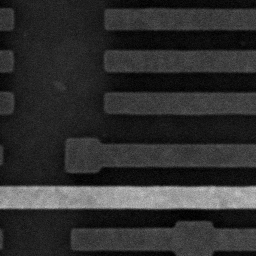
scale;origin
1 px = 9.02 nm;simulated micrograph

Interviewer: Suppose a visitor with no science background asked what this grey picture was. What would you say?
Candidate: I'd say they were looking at wiring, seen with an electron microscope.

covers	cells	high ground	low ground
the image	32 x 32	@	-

--------------------------------
@@-----------@@@@@@@@@@@@@@@@@@@
@@-----------@@@@@@@@@@@@@@@@@@@
@------------@@@@@@@@@@@@@@@@@@@
--------------------------------
--------------------------------
@------------@@@@@@@@@@@@@@@@@@@
@@-----------@@@@@@@@@@@@@@@@@@@
@@-----------@@@@@@@@@@@@@@@@@@@
--------------------------------
--------------------------------
--------------------------------
@@-----------@@@@@@@@@@@@@@@@@@@
@@-----------@@@@@@@@@@@@@@@@@@@
--------------------------------
--------------------------------
--------------------------------
---------@@@--------------------
--------@@@@@@@@@@@@@@@@@@@@@@@@
--------@@@@@@@@@@@@@@@@@@@@@@@@
--------@@@@@@@@@@@@@@@@@@@@@@@@
---------@@@--------------------
--------------------------------
@@@@@@@@@@@@@@@@@@@@@@@@@@@@@@@@
@@@@@@@@@@@@@@@@@@@@@@@@@@@@@@@@
@@@@@@@@@@@@@@@@@@@@@@@@@@@@@@@@
--------------------------------
--------------------------------
----------------------@@@@@-----
---------@@@@@@@@@@@@@@@@@@@@@@@
---------@@@@@@@@@@@@@@@@@@@@@@@
----------------------@@@@@-----